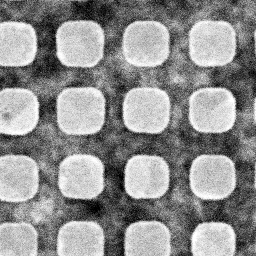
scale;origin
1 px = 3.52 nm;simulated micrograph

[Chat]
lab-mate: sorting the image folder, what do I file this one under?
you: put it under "a regular array of raised bodies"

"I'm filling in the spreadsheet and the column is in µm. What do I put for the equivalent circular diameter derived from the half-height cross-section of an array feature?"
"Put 0.166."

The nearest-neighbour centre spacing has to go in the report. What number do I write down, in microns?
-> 0.232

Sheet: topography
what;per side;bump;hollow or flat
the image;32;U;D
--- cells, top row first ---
DDDDDDDDDDDDDDDDDDDDDDDDDDDDDDDD
DDDDDDDDDDDDDDDDDDDDDDDDDDDDDDDD
DDDDDDDDDDDDDDDDDDDDDDDDDDDDDDDD
UUUUDDDDUUUUUDDDUUUUUDDDUUUUUDDD
UUUUDDDUUUUUUDDUUUUUUDDDUUUUUDDD
UUUUDDDUUUUUUDDUUUUUUDDDUUUUUDDD
UUUUDDDUUUUUUDDUUUUUUDDDUUUUUDDD
UUUUDDDDUUUUDDDDUUUUUDDDUUUUUDDD
DDDDDDDDDDDDDDDDDDDDDDDDDDDDDDDD
DDDDDDDDDDDDDDDDDDDDDDDDDDDDDDDD
DDDDDDDDDDDDDDDDDDDDDDDDDDDDDDDD
UUUUDDDDUUUUDDDDUUUUDDDDDUUUUDDD
UUUUUDDUUUUUUDDDUUUUUDDDUUUUUDDD
UUUUUDDUUUUUUDDDUUUUUDDDUUUUUDDD
UUUUUDDUUUUUUDDDUUUUUDDDUUUUUDDD
UUUUDDDUUUUUUDDDUUUUUDDDUUUUUDDD
UUUDDDDDUUUUDDDDDDUUDDDDDDDDDDDD
DDDDDDDDDDDDDDDDDDDDDDDDDDDDDDDD
DDDDDDDDDDDDDDDDDDDDDDDDDDDDDDDD
DDDDDDDDDDDDDDDDDDDDDDDDDDDDDDDD
UUUUDDDDUUUUUDDDUUUUUDDDUUUUUDDD
UUUUUDDDUUUUUDDDUUUUUDDDUUUUUDDD
UUUUUDDDUUUUUDDDUUUUUDDDUUUUUDDD
UUUUUDDDUUUUUDDDUUUUUDDDUUUUUDDD
UUUUDDDDUUUUDDDDDUUUDDDDDUUUDDDD
DDDDDDDDDDDDDDDDDDDDDDDDDDDDDDDD
DDDDDDDDDDDDDDDDDDDDDDDDDDDDDDDD
DDDDDDDDDDDDDDDDDDDDDDDDDDDDDDDD
UUUUDDDDUUUUUDDDUUUUUDDDDUUUUDDD
UUUUUDDUUUUUUDDDUUUUUDDDUUUUUDDD
UUUUUDDUUUUUUDDDUUUUUDDDUUUUUDDD
UUUUUDDUUUUUUDDDUUUUUDDDUUUUUDDD